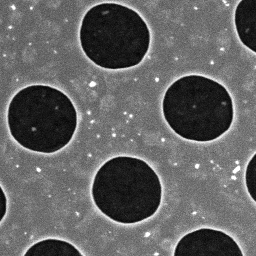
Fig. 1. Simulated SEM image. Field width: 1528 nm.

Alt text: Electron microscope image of holes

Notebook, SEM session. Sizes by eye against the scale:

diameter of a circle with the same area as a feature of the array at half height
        408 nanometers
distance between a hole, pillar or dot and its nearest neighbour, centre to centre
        651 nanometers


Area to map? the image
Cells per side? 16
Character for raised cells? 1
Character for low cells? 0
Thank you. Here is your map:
1111110011111110
1111100001111110
1111100001111110
1111100001111111
1111111111111111
1101111111100011
1000011111000001
1000011111000001
1000011111100011
1101111111111111
1111110001111110
1111110000111110
1111110000111111
1111111001111111
1111111111110011
1100011111100001